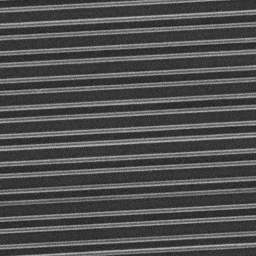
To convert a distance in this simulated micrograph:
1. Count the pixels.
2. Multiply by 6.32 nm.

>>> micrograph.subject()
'parallel lines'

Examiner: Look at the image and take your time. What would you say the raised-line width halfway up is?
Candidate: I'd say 0.0229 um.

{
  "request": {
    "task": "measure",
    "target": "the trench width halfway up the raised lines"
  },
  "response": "0.0513 µm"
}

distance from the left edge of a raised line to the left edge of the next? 87.1 nm